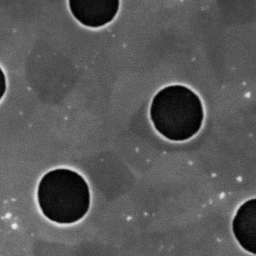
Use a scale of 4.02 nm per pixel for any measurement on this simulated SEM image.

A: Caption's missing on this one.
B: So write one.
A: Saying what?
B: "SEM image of holes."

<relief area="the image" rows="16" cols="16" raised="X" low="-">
XXXX---XXXXXXXXX
XXXXX--XXXXXXXXX
XXXXXXXXXXXXXXXX
XXXXXXXXXXXXXXXX
XXXXXXXXXXXXXXXX
XXXXXXXXXX--XXXX
XXXXXXXXX----XXX
XXXXXXXXX----XXX
XXXXXXXXXX--XXXX
XXXXXXXXXXXXXXXX
XXXXXXXXXXXXXXXX
XX---XXXXXXXXXXX
XX----XXXXXXXXXX
XXX--XXXXXXXXXX-
XXXXXXXXXXXXXXX-
XXXXXXXXXXXXXXX-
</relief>